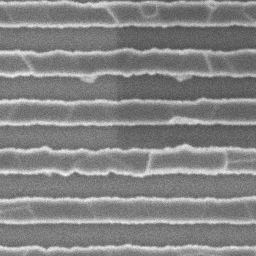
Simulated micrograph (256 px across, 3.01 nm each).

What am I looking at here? lines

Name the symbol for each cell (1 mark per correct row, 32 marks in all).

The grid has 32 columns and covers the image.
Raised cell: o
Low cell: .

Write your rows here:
oooooooooo.ooooooooooooooooooooo
oooooooooooooooooooooooooooooooo
oooooooooooooooooooooooooooooooo
................................
................................
................................
oooo..oooo.ooooooooooooooooo.ooo
oooooooooooooooooooooooooooooooo
oooooooooooooooooooooooooooooooo
oo..oo...ooo.............oo..ooo
................................
................................
..o.............o........ooooooo
oooooooooooooooooooooooooooooooo
oooooooooooooooooooooooooooooooo
oooo...ooooooo.oo...............
................................
................................
.....o................oo..ooo...
oooooooooooooooooooooooooooooooo
oooooooooooooooooooooooooooooooo
ooooo..oo.oooooooooooooooooooooo
................................
................................
................................
oooooooooooooooooooooooooooooooo
oooooooooooooooooooooooooooooooo
oooooooooooooooooooooooooooooooo
................................
................................
................................
oooooooooooooooooooooooooooooooo